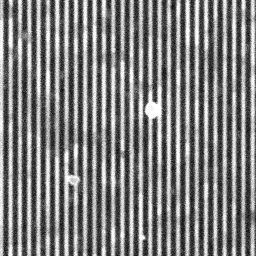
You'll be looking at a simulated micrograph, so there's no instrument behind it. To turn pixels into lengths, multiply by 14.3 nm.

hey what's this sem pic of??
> parallel lines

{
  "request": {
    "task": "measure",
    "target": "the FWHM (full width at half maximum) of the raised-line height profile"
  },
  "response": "34 nanometres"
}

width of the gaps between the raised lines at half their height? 96.6 nm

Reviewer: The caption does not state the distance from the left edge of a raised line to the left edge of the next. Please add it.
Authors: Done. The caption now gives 133 nm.